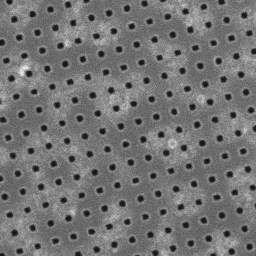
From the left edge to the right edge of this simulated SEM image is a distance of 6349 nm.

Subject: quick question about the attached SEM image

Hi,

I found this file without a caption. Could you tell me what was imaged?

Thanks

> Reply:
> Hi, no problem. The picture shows a regular array of holes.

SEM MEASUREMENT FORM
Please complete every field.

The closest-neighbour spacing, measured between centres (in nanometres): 456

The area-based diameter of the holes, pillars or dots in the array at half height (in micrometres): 0.183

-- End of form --